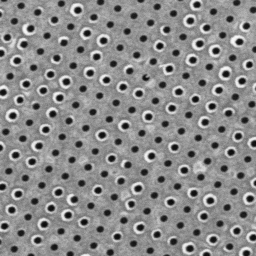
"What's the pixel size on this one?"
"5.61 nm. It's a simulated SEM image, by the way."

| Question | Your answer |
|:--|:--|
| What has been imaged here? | a regular array of holes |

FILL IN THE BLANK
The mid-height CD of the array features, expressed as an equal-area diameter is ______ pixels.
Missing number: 7.13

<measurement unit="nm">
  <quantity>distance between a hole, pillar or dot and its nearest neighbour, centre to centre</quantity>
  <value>97.2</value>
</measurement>